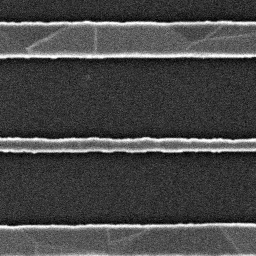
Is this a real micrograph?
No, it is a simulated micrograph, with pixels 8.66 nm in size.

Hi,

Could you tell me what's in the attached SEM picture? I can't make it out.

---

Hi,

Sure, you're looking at lines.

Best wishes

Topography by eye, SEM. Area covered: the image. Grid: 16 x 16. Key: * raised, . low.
................
****************
****************
*******.........
................
................
................
................
................
..*.....*.......
................
................
................
................
****************
****************